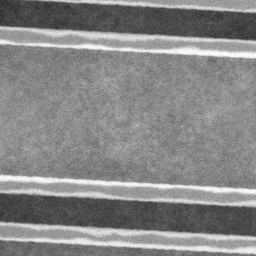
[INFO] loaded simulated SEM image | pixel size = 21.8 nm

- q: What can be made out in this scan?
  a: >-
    lines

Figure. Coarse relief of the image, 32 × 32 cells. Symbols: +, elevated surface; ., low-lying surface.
..............++++++++++++++++++
...............................+
................................
++..............................
++++++++++++++++++++............
..++++++++++++++++++++++++++++++
....................++++++++++++
................................
................................
................................
................................
................................
................................
................................
................................
................................
................................
................................
................................
................................
................................
................................
++++++++........................
++++++++++++++++++++++++++......
........++++++++++++++++++++++++
.........................+++++++
................................
................................
+++++++++++.....................
++++++++++++++++++++++++++++....
...........+++++++++++++++++++++
............................++++